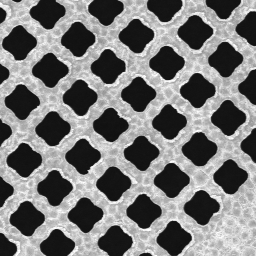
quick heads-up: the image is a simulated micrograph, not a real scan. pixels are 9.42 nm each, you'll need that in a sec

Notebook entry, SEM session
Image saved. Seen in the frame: a regular array of holes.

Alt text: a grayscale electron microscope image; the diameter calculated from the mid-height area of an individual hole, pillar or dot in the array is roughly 297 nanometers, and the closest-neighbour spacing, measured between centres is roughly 0.385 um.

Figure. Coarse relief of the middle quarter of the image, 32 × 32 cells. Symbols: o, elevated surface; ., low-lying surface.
.oooooo........oooooo.........oo
.oooooo........ooooooo.......ooo
.ooooooo......oooooooooo....oooo
ooooooooo....ooooo..ooooo..oooo.
ooo..ooooo..ooooo....oooooooooo.
oo....oooooooooo.....ooooooooo..
o......oooooooo........oooooo...
........oooooo.........oooooo...
........oooooo.........ooooooo..
........ooooooo.......ooooooooo.
o......oooooooooo....oooo..ooooo
oo....oooo...oooo...oooo....oooo
ooo..ooooo....oooooooooo.....ooo
ooooooooo......oooooooo........o
.oooooo.........oooooo.........o
..ooooo.........oooooo........oo
..ooooo.........ooooooo......ooo
.oooooooo.....oooooooooo.....ooo
oooooooooo....oooo...oooo...oooo
ooo...ooooo.ooooo....oooooooooo.
oo.....ooooooooo.......ooooooo..
o.......ooooooo.........ooooo...
.........oooooo.........oooooo..
.........oooooo........oooooooo.
o.......ooooooooo.....oooooooooo
oo.....ooooooooooo...oooo...oooo
ooo...ooooo...ooooo..oooo....ooo
oooo..oooo.....ooooooooo.......o
ooooooooo.......ooooooo........o
.ooooooo.........ooooo.........o
..oooooo.........oooooo.......oo
..ooooooo.......oooooooo......oo